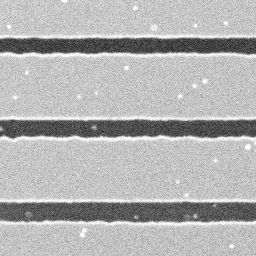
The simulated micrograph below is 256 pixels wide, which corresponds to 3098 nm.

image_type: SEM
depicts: lines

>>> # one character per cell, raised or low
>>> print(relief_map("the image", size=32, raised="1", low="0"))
11111111111111111111111111111111
11111111111111111111111111111111
11111111111111111111111111111111
11111111111111111111111111111111
11111111111111111111111111111111
00000000000000000000000000000000
00000000000000000000000000000000
11111111111111111111111111111111
11111111111111111111111111111111
11111111111111111111111111111111
11111111111111111111111111111111
11111111111111111111111111111111
11111111111111111111111111111111
11111111111111111111111111111111
11111111111111111111111111111111
00000000000000000000000000000000
00000000000000000000000000000000
11111111111111111111111111111111
11111111111111111111111111111111
11111111111111111111111111111111
11111111111111111111111111111111
11111111111111111111111111111111
11111111111111111111111111111111
11111111111111111111111111111111
11111111111111111111111111111111
00000000000000000000000000000000
00000000000000000000000000000000
00000000000000000000000000000000
11111111111111111111111111111111
11111111111111111111111111111111
11111111111111111111111111111111
11111111111111111111111111111111